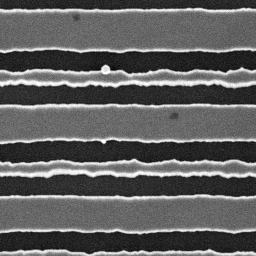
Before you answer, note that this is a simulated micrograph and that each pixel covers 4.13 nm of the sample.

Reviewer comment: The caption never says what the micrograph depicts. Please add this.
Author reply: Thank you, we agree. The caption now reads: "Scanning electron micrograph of lines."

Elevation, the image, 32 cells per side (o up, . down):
................................
oooooooooooooooooooooooooooooooo
oooooooooooooooooooooooooooooooo
oooooooooooooooooooooooooooooooo
oooooooooooooooooooooooooooooooo
oooooooooooooooooooooooooooooooo
o.........o...o............o....
................................
.............o..................
oooooooooooooooooooooooooooooooo
o...oooooooooooo.ooooo.ooo.ooooo
................................
................................
oooooooooooooooooooooooooooooooo
oooooooooooooooooooooooooooooooo
oooooooooooooooooooooooooooooooo
oooooooooooooooooooooooooooooooo
ooooooo.oooooo.ooooooooooooooooo
................................
................................
oooooooooooooooooooooooooooooooo
oooooooooooooooooooooooooooooooo
................................
................................
.ooooooooo....o.....o.oooooo....
oooooooooooooooooooooooooooooooo
oooooooooooooooooooooooooooooooo
oooooooooooooooooooooooooooooooo
oooooooooooooooooooooooooooooooo
................................
................................
ooooooooo...oo.oooooooooooo..ooo